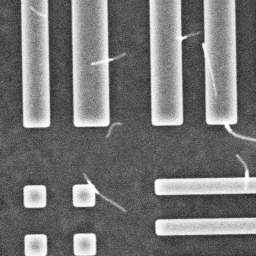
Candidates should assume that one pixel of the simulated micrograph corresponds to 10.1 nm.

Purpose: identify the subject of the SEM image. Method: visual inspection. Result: groups of lines, slits or small figures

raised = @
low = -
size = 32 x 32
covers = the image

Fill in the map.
---@@@---@@@@------@@@@---@@@---
---@@@---@@@@------@@@@---@@@---
---@@@---@@@@------@@@@---@@@---
---@@@---@@@@------@@@@---@@@---
---@@@---@@@@------@@@@---@@@---
---@@@---@@@@------@@@@---@@@---
---@@@---@@@@------@@@@---@@@---
---@@@---@@@@@-----@@@@---@@@---
---@@@---@@@@@-----@@@@---@@@---
---@@@---@@@@@-----@@@@---@@@---
---@@@---@@@@@-----@@@@---@@@@--
---@@@---@@@@@-----@@@@---@@@@--
---@@@---@@@@@-----@@@@---@@@@--
---@@@---@@@@@-----@@@@---@@@@--
---@@@---@@@@@-----@@@@---@@@@--
---@@@---@@@@------@@@----@@@---
--------------------------------
--------------------------------
--------------------------------
--------------------------------
--------------------------------
--------------------------------
--------------------@@@@@@@@@@@@
---@@@---@@@-------@@@@@@@@@@@@@
---@@@---@@@--------------------
---@@@---@@@--------------------
--------------------------------
----------------------@@@@@@@@@@
--------------------@@@@@@@@@@@@
---@@----@@@--------------------
---@@@---@@@--------------------
---@@@---@@@--------------------